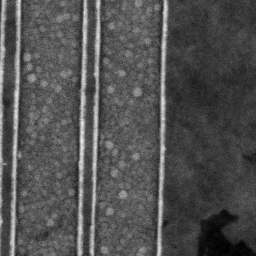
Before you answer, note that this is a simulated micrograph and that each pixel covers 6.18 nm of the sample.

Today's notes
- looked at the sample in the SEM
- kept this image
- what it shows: one or a few lines or trenches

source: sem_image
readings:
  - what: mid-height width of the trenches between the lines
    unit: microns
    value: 0.4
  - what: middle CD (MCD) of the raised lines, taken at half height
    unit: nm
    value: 95.8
